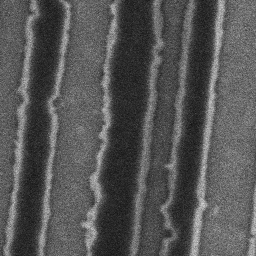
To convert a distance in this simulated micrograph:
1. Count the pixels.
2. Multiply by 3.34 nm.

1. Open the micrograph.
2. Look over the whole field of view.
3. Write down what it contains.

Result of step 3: one or a few lines or trenches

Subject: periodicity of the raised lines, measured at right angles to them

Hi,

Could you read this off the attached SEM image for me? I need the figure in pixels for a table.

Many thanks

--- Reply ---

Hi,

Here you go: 77.1